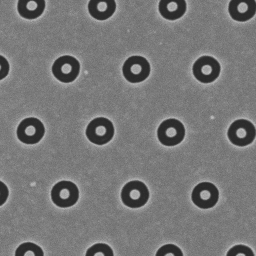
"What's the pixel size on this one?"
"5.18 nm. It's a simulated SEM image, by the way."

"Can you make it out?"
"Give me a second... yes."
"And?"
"a regular array of ring-shaped grooves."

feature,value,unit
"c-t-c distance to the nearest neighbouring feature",363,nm